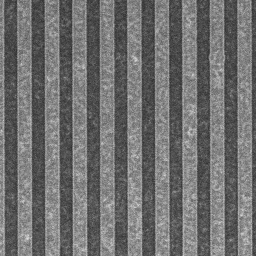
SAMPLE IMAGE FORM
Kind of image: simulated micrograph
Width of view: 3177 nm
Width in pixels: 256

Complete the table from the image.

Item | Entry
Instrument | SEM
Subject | parallel lines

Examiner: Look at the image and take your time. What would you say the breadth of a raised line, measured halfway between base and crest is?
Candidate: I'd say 13.4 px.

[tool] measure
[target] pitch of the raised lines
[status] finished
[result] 341 nm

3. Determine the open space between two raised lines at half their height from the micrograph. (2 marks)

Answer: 166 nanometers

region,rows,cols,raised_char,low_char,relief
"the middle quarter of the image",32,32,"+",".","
..++++...+++....+++....+++....++
..++++...+++....+++....+++....++
..++++...+++....+++....+++....++
..++++...+++....+++....+++....++
..++++...+++....+++....+++....++
..++++...+++....+++....+++....++
..++++...+++....+++....+++....++
..++++...+++....+++....+++....++
..++++...+++....+++....+++....++
..++++...+++....+++....+++....++
..++++...+++....+++....+++....++
..++++...+++....+++....+++....++
..++++...+++....+++....+++....++
..++++...+++....+++....+++....++
..++++...+++....+++....+++....++
..++++...+++....+++....+++....++
..++++...+++....+++....+++....++
..++++...+++....+++....+++....++
..++++...+++....+++....+++....++
..++++...+++....+++....+++....++
..++++...+++....+++....+++....++
..++++...+++....+++....+++....++
..++++...+++....+++....+++....++
..++++...+++....+++....+++....++
..++++...+++....+++....+++....++
..++++...+++....+++....+++....++
..++++...+++....+++....+++....++
..++++...+++....+++....+++....++
..++++...+++....+++....+++....++
..++++...+++....+++....+++....++
..++++...+++....+++....+++....++
..++++...+++....+++....+++....++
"